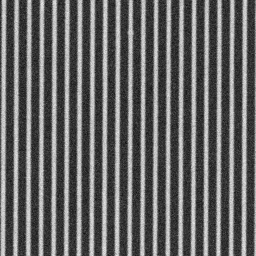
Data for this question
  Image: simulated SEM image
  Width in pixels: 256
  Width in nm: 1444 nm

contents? parallel lines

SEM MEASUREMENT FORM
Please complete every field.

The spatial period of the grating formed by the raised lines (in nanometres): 71.6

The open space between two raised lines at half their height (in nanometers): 53.6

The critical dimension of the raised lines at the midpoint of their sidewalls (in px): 3.12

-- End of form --